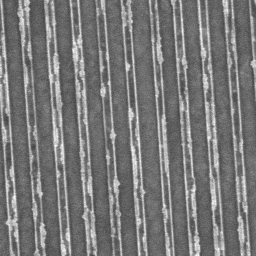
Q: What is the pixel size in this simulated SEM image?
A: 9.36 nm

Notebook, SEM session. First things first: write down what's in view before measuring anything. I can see parallel lines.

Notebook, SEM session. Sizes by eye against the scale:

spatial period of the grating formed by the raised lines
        239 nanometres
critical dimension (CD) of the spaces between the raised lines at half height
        164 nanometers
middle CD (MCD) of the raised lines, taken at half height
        72.4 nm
